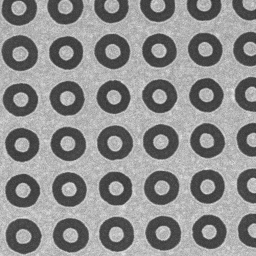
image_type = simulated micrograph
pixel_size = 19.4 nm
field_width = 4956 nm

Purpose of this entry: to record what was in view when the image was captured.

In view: a regular array of ring-shaped grooves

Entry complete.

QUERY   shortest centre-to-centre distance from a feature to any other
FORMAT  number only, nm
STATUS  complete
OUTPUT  882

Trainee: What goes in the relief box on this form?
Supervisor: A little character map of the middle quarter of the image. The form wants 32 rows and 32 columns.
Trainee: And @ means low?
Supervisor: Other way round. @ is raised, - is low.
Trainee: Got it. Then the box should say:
----@@@@@@-----@@@@@@@----@@@@@@
-@@@@@@@@@@@@@@@@@@@@@@@@@@@@@@@
@@@@@@@@@@@@@@@@@@@@@@@@@@@@@@@@
@@@@@@@@@@@@@@@@@@@@@@@@@@@@@@@@
--@@@@@@@@----@@@@@@@------@@@@@
----@@@@@-------@@@@@-------@@@@
-----@@@@-------@@@@---@----@@@@
@@---@@@---@@@---@@---@@@---@@@-
@@@--@@@---@@@---@@---@@@@--@@@-
@@---@@@---@@@--@@@@---@@---@@@@
-----@@@@-------@@@@@------@@@@@
----@@@@@@-----@@@@@@@-----@@@@@
---@@@@@@@@@-@@@@@@@@@@@@@@@@@@@
@@@@@@@@@@@@@@@@@@@@@@@@@@@@@@@@
@@@@@@@@@@@@@@@@@@@@@@@@@@@@@@@@
@@@@@@@@@@@@--@@@@@@@@-----@@@@@
----@@@@@@------@@@@@-------@@@@
-----@@@@--------@@@--------@@@@
@@---@@@---@@@---@@@---@@@---@@@
@@@---@@---@@@---@@@--@@@@---@@-
@@@---@@---@@@---@@@---@@@---@@@
@@---@@@----@@---@@@--------@@@@
-----@@@@-------@@@@@------@@@@@
----@@@@@@-----@@@@@@@----@@@@@@
@@@@@@@@@@@@@@@@@@@@@@@@@@@@@@@@
@@@@@@@@@@@@@@@@@@@@@@@@@@@@@@@@
@@@@@@@@@@@@@@@@@@@@@@@@@@@@@@@@
---@@@@@@@@----@@@@@@@-----@@@@@
-----@@@@@------@@@@@-------@@@@
-----@@@@---@@---@@@---@@----@@@
@@@---@@@--@@@@--@@@---@@@---@@-
@@@---@@@--@@@@--@@@---@@@---@@-